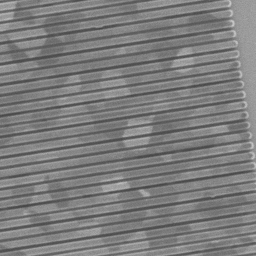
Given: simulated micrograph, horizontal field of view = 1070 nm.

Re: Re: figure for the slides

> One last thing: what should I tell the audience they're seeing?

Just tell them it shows parallel lines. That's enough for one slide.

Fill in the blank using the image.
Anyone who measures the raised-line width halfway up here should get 0.0283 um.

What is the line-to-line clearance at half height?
0.016 microns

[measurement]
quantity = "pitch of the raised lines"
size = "42.9 nm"